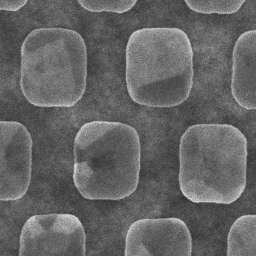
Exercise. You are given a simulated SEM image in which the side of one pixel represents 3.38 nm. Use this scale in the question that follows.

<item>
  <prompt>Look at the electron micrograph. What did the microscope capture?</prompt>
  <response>raised bodies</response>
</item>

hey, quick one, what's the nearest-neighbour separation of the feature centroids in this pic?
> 358 nanometers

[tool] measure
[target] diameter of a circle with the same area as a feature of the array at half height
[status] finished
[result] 261 nm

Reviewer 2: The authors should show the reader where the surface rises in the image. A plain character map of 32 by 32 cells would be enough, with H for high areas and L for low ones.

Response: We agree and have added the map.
HHHLLLLLLLHHHHHHHLLLLLLHHHHHHHLL
LLLLLLLLLLLLLLHLLLLLLLLLLHHHHLLL
LLLLLLLLLLLLLLLLLLLLLLLLLLLLLLLL
LLLLLLLLLLLLLLLLLLLLLLLLLLLLLLLL
LLLHHHHHHHLLLLLLHHHHHHHLLLLLLLHH
LLLHHHHHHHHLLLLLHHHHHHHHLLLLLHHH
LLLHHHHHHHHLLLLLHHHHHHHHLLLLLHHH
LLLHHHHHHHHLLLLLHHHHHHHHLLLLLHHH
LLLHHHHHHHHLLLLLHHHHHHHHLLLLLHHH
LLLHHHHHHHHLLLLLHHHHHHHHLLLLLHHH
LLLHHHHHHHHLLLLLHHHHHHHHLLLLLHHH
LLLHHHHHHHLLLLLLHHHHHHHHLLLLLHHH
LLLLHHHHHHLLLLLLLHHHHHHLLLLLLHHH
LLLLLLLLLLLLLLLLLLLLLLLLLLLLLLLH
LLLLLLLLLLLLLLLLLLLLLLLLLLLLLLLL
HHHLLLLLLLLHHHHHLLLLLLLLLLLLLLLL
HHHHLLLLLLHHHHHHHLLLLLLHHHHHHHLL
HHHHLLLLLHHHHHHHHLLLLLLHHHHHHHHL
HHHHLLLLLHHHHHHHHLLLLLHHHHHHHHHL
HHHHLLLLLLHHHHHHHHLLLLHHHLLHHHHL
HHHHLLLLLLLLLLHHHLLLLLHHHHHHHHHL
HHHHLLLLLLHHHHHHHLLLLLHHHHHHHHHL
HHHHLLLLLLHHHHHHHLLLLLHHHHHHHHHL
HHHLLLLLLLHHHHHHHLLLLLLHHHHHHHLL
HHHLLLLLLLHHHHHHLLLLLLLHHHHHHHLL
LLLLLLLLLLLLLLLLLLLLLLLLLLLLLLLL
LLLLLLLLLLLLLLLLLLLLLLLLLLLLLLLL
LLLLHHHHHHLLLLLLLHHHHHHLLLLLLLHH
LLLHHHHHHHLLLLLLHHHHHHHLLLLLLHHH
LLLHHHHHHHHLLLLLHHHHHHHHLLLLLHHH
LLLHHHHHHHHLLLLLHHHHHHHHLLLLLHHH
LLHHHHHHHHHLLLLLHHHHHHHHLLLLLHHH